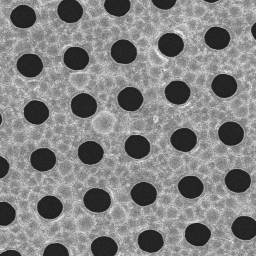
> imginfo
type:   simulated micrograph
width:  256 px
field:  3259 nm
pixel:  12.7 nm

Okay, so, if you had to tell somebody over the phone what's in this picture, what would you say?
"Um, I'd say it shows a regular array of holes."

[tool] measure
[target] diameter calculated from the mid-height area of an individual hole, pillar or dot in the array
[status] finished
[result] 318 nm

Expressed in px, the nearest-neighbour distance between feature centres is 47.2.